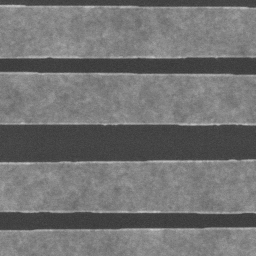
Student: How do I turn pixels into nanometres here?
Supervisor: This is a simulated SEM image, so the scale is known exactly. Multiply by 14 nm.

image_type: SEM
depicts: lines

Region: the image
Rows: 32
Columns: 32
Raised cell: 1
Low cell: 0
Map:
00000000000000000000000000000000
11111111111111111111111111111111
11111111111111111111111111111111
11111111111111111111111111111111
11111111111111111111111111111111
11111111111111111111111111111111
11111111111111111111111111111111
00000000000000000000000000000000
00000000000000000000000000000000
11111111111111111111111111111111
11111111111111111111111111111111
11111111111111111111111111111111
11111111111111111111111111111111
11111111111111111111111111111111
11111111111111111111111111111111
00000000000001100000001111110011
00000000000000000000000000000000
00000000000000000000000000000000
00000000000000000000000000000000
00000000000000000000000000000000
11111111111111111111111111111111
11111111111111111111111111111111
11111111111111111111111111111111
11111111111111111111111111111111
11111111111111111111111111111111
11111111111111111111111111111111
00111011110111111111111111111111
00000000000000000000000000000000
00000000000000000000000000000000
11111111111111111111111111111111
11111111111111111111111111111111
11111111111111111111111111111111